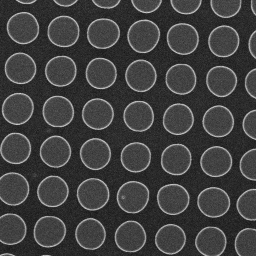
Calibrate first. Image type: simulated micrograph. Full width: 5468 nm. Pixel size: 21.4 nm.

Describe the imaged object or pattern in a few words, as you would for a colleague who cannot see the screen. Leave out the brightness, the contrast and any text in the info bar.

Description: an array of small figures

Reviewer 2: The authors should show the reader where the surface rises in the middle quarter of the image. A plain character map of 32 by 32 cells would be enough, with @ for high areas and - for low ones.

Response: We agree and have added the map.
@@@---@@@@@@@---@@@@@@-----@@@@-
@@@---@@@@@@@---@@@@@@@---@@@@@@
@@@---@@@@@@@--@@@@@@@@---@@@@@@
@@----@@@@@@@--@@@@@@@@---@@@@@@
@@----@@@@@@@---@@@@@@@---@@@@@@
-------@@@@-----@@@@@@----@@@@@@
-----------------@@@@------@@@@@
-----------------------------@--
--------------------------------
@@----@@@@@-------@@------------
@@---@@@@@@@----@@@@@------@@@@-
@@---@@@@@@@---@@@@@@@----@@@@@@
@@---@@@@@@@---@@@@@@@---@@@@@@@
@@---@@@@@@@---@@@@@@@---@@@@@@@
@@---@@@@@@@---@@@@@@@---@@@@@@@
------@@@@@-----@@@@@@---@@@@@@@
-----------------@@@------@@@@@-
---------------------------@@@--
--------------------------------
@----@@@@@----------------------
@----@@@@@@-----@@@@@-----@@@@--
@@--@@@@@@@----@@@@@@----@@@@@@-
@@--@@@@@@@@--@@@@@@@@---@@@@@@@
@---@@@@@@@@--@@@@@@@@--@@@@@@@@
@----@@@@@@---@@@@@@@---@@@@@@@@
------@@@@-----@@@@@@----@@@@@@@
----------------@@@@-----@@@@@@-
---------------------------@@@--
--------------------------------
-----@@@@@------@@@-------------
@---@@@@@@@---@@@@@@-----@@@@---
@--@@@@@@@@---@@@@@@@---@@@@@@--